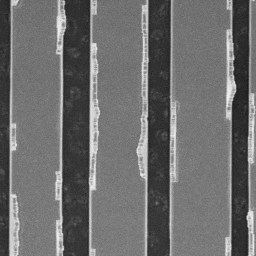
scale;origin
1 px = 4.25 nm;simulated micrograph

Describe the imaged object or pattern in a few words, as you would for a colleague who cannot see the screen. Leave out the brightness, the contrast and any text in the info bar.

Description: one or a few lines or trenches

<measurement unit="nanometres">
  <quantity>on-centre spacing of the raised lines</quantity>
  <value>350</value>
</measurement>